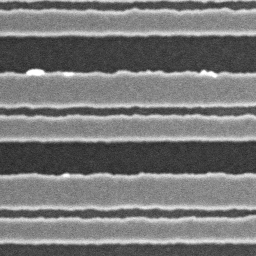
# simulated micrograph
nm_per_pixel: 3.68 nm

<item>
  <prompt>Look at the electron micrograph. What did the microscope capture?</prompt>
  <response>lines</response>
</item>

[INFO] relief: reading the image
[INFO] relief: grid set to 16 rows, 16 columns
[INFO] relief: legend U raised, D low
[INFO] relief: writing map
UUUUUUUUUUUUUUUU
UUUUUUUUUUUUUUUU
DDDDDDDDDDDDDDDD
DDDDDDDDDDDDDDDD
DDUDDDDUDUDUDDDD
UUUUUUUUUUUUUUUU
UUUUUUUUUUUUUUUU
UUUUUUUUUUUUUUUU
UUUUUUUUUUUUUUUU
DDDDDDDDDDDDDDDD
DDDDDDDDDDDDDDDD
UUUUUUUUUUUUUUUU
UUUUUUUUUUUUUUUU
UUUUUUUUUUUUUUUU
UUUUUUUUUUUUUUUU
DDDDDDDDDDDDDDDD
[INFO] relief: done